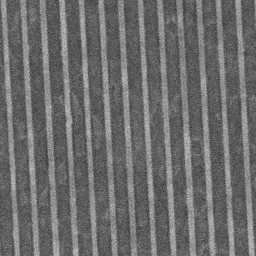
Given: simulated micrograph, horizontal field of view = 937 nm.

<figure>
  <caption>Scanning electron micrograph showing parallel lines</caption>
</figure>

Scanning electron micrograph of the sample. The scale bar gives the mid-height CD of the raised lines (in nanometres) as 17.8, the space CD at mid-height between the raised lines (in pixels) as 14.5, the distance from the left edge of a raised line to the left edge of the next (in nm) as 71.4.